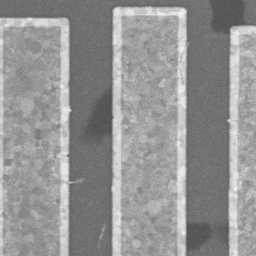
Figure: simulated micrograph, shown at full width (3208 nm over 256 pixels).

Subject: one or a few lines or trenches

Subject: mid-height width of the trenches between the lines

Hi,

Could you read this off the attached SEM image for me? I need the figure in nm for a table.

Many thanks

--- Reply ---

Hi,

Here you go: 675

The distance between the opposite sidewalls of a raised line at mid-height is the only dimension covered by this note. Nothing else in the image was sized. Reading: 793 nm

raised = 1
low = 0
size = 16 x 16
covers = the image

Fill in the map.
0000000000000000
1111000111100000
1111000111100001
1111000111100001
1111000111100001
1111000111100001
1111000111100001
1111000111100001
1111000111100001
1111000111100001
1111000111100001
1111000111100001
1111000111100001
1111000111100001
1111000111100001
1111000111100001